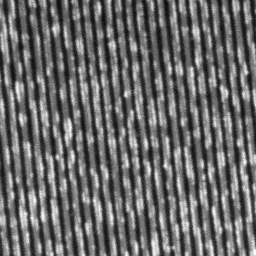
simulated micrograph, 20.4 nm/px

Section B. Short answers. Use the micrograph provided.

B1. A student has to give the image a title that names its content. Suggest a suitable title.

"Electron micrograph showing parallel lines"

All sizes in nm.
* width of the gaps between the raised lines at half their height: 116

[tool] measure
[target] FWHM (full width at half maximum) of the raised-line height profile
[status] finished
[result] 98.7 nm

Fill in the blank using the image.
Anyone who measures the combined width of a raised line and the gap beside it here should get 217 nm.